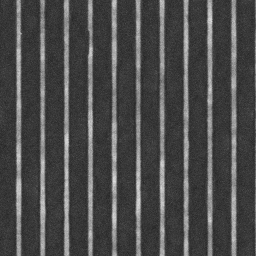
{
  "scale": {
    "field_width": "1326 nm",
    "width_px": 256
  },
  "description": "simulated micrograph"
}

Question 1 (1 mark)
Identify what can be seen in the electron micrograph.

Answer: parallel lines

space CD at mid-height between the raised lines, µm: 0.106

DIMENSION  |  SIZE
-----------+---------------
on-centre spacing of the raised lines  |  124 nm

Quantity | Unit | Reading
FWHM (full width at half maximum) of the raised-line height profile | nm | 20.1